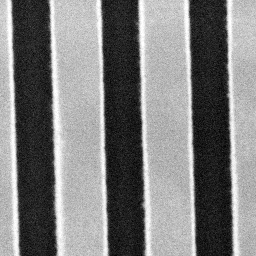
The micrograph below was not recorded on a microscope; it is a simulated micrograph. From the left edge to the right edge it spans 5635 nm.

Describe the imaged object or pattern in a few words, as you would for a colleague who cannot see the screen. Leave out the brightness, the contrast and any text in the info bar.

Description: lines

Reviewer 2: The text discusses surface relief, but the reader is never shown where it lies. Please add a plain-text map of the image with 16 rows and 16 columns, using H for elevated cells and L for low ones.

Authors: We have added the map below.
HLLHHHLLLHHHLLHH
HLLHHHLLLHHHLLHH
HLLHHHLLLHHHLLHH
HLLHHHLLLHHHLLHH
HLLHHHLLLHHHLLHH
HLLHHHLLLHHHLLHH
HLLHHHLLLHHHLLHH
HLLHHHHLLHHHLLHH
HLLHHHHLLHHHLLHH
HLLHHHHLLHHHLLHH
HLLHHHHLLHHHLLHH
HLLHHHHLLHHHLLLH
HLLHHHHLLHHHLLLH
HLLLHHHLLHHHLLLH
HLLLHHHLLHHHLLLH
HLLLHHHLLHHHLLLH